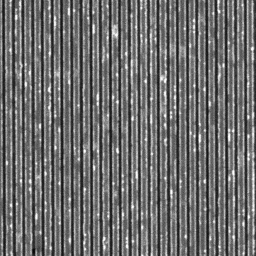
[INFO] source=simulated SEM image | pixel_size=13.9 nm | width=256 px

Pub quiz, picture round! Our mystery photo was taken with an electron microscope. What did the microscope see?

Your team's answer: parallel lines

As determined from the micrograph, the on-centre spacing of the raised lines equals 134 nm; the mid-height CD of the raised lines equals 5.88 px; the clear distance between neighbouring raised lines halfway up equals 46.8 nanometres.